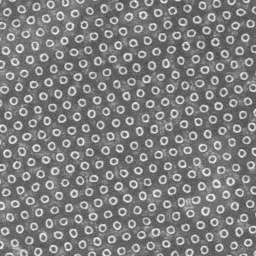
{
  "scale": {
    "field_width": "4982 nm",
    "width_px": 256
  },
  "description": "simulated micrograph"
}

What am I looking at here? a regular array of raised bodies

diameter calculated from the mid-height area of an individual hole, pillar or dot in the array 135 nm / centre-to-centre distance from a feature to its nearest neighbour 276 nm